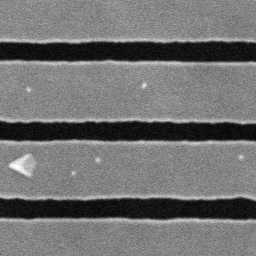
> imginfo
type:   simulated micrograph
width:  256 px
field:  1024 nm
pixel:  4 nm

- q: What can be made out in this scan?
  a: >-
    lines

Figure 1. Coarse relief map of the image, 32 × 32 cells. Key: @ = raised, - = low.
@@@@@@@@@@@@@@@@@@@@@@@@@@@@@@@@
@@@@@@@@@@@@@@@@@@@@@@@@@@@@@@@@
@@@@@@@@@@@@@@@@@@@@@@@@@@@@@@@@
@@@@@@@@@@@@@@@@@@@@@@@@@@@@@@@@
@@@@@@@@@@@@@@@@@@@@@@@@@@@@@@@@
--------------------------------
--------------------------------
--------------------------------
@@@@@@@@@@@@@@@@@@@@@@@@@@@@@@@@
@@@@@@@@@@@@@@@@@@@@@@@@@@@@@@@@
@@@@@@@@@@@@@@@@@@@@@@@@@@@@@@@@
@@@@@@@@@@@@@@@@@@@@@@@@@@@@@@@@
@@@@@@@@@@@@@@@@@@@@@@@@@@@@@@@@
@@@@@@@@@@@@@@@@@@@@@@@@@@@@@@@@
@@@@@@@@@@@@@@@@@@@@@@@@@@@@@@@@
--------------------------------
--------------------------------
--------------------------------
@@@@@@@@@@@@@@@@@@@@@@@@@@@@@@@@
@@@@@@@@@@@@@@@@@@@@@@@@@@@@@@@@
@@@@@@@@@@@@@@@@@@@@@@@@@@@@@@@@
@@@@@@@@@@@@@@@@@@@@@@@@@@@@@@@@
@@@@@@@@@@@@@@@@@@@@@@@@@@@@@@@@
@@@@@@@@@@@@@@@@@@@@@@@@@@@@@@@@
@@@@@@@@@@@@@@@@@@@@@@@@@@@@@@@@
--------------------------------
--------------------------------
@@@@@@@@@@@@@@@@@@@--@@@@@@@@---
@@@@@@@@@@@@@@@@@@@@@@@@@@@@@@@@
@@@@@@@@@@@@@@@@@@@@@@@@@@@@@@@@
@@@@@@@@@@@@@@@@@@@@@@@@@@@@@@@@
@@@@@@@@@@@@@@@@@@@@@@@@@@@@@@@@